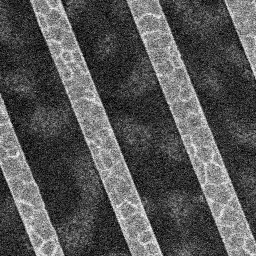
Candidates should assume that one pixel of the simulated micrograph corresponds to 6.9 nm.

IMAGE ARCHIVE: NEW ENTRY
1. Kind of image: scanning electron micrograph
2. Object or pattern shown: one or a few lines or trenches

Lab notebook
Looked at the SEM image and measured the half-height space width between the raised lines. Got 429 nanometers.